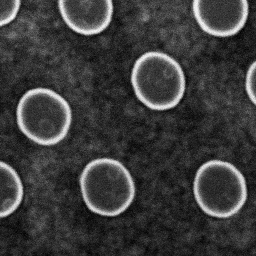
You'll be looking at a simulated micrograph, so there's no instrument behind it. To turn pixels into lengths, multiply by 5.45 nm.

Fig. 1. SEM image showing raised bodies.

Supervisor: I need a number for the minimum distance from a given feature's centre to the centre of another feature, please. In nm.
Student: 566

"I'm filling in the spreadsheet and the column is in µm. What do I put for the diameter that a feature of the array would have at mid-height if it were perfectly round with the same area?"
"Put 0.284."